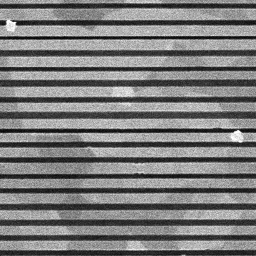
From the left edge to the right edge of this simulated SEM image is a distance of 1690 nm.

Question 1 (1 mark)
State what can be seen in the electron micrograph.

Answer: parallel lines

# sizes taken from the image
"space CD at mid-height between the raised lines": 34.7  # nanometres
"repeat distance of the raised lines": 15.4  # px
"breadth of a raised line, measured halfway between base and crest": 69.3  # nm